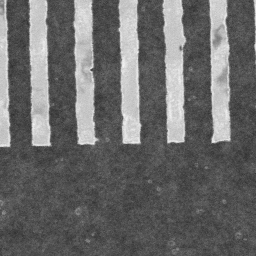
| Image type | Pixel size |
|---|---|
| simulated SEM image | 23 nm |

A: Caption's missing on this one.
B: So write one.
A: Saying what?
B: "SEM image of parallel lines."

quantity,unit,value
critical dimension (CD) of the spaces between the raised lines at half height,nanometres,650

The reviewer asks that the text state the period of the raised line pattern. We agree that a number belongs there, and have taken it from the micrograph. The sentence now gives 1040 nanometers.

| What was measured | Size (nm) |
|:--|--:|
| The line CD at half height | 379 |